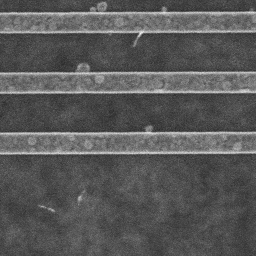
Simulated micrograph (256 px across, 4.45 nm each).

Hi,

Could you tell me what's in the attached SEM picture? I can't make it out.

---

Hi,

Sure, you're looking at parallel lines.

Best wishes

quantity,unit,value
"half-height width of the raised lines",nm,90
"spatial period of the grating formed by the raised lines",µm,0.268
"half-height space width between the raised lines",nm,176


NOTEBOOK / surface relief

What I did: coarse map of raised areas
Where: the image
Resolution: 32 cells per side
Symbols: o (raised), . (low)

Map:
................................
................................
oooooooooooooooooooooooooooooooo
oooooooooooooooooooooooooooooooo
................................
................................
................................
................................
................................
oooooooooooooooooooooooooooooooo
oooooooooooooooooooooooooooooooo
oooooooooooooooooooooooooooooooo
................................
................................
................................
................................
................................
oooooooooooooooooooooooooooooooo
oooooooooooooooooooooooooooooooo
................................
................................
................................
................................
................................
................................
................................
................................
................................
................................
................................
................................
................................